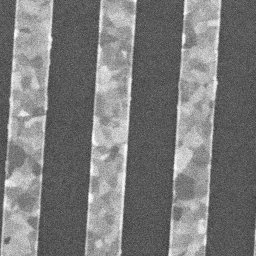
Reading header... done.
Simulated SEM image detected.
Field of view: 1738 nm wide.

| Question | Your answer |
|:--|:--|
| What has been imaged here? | one or a few lines or trenches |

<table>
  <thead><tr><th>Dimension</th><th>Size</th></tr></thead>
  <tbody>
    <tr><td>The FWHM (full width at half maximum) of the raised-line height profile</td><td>240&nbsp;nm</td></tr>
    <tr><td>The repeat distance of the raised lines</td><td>569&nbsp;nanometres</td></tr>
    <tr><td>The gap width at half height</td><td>0.332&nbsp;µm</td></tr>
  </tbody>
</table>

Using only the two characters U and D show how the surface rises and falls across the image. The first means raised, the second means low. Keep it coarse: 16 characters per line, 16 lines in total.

DUUDDDUUDDDDUUDD
DUUDDDUUDDDUUUDD
DUUDDDUUDDDUUUDD
DUUDDDUUDDDUUUDD
DUUDDDUUDDDUUUDD
DUUDDDUUDDDUUDDD
DUUDDDUUDDDUUDDD
DUUDDDUUDDDUUDDD
DUUDDDUUDDDUUDDD
UUUDDDUUDDDUUDDD
UUUDDDUUDDDUUDDD
UUUDDDUUDDDUUDDD
UUUDDDUUDDDUUDDD
UUDDDDUUDDDUUDDD
UUDDDUUUDDDUUDDD
UUDDDUUUDDDUUDDD